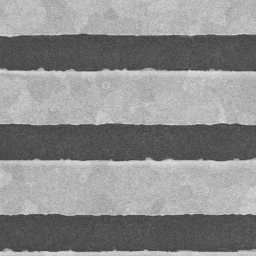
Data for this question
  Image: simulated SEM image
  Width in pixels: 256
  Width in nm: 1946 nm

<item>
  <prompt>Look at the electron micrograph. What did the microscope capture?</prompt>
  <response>lines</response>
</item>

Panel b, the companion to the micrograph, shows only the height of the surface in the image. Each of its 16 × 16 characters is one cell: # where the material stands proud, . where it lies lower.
################
################
................
................
#...............
################
################
################
................
................
################
################
################
................
................
................